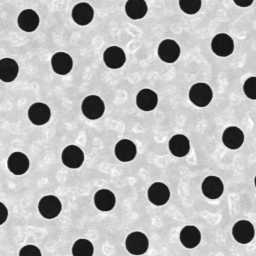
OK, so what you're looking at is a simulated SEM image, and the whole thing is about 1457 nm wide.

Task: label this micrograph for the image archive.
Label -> a regular array of holes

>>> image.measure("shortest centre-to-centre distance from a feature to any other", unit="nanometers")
304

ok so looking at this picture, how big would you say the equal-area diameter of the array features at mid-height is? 128 nanometres